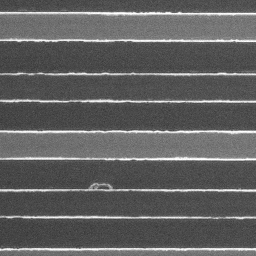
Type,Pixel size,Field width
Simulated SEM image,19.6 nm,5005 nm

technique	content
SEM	lines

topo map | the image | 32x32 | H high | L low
LLLLLLLLLLLLLLLLLLLLLLLLLLLLLLLL
LLLLLLLLLLLLLLLLLLLLLLLLLLLLLLLL
HHHHHHHHHHHHHHHHHHHHHHHHHHHHHHHH
HHHHHHHHHHHHHHHHHHHHHHHHHHHHHHHH
HHHHHHHHHHHHHHHHHHHHHHHHHHHHHHHH
LLLLLLLLLLLLLLLLLLLLLLLLLLLLLLLL
LLLLLLLLLLLLLLLLLLLLLLLLLLLLLLLL
LLLLLLLLLLLLLLLLLLLLLLLLLLLLLLLL
LLLLLLLLLLLLLLLLLLLLLLLLLLLLLLLL
HHHHHHHHHHHHHHHHHHHHHHHHHHHHHHHH
HHHHHHHHHHHHHHHHHHHHHHHHHHHHHHHH
HHHHHHHHHHHHHHHHHHHHHHHHHHHHHHHH
HHHHHHHHHHHHHHHHHHHHHHHHHHHHHHHH
LLLLLLLLLLLLLLLLLLLLLLLLLLLLLLLL
LLLLLLLLLLLLLLLLLLLLLLLLLLLLLLLL
LLLLLLLLLLLLLLLLLLLLLLLLLLLLLLLL
HLLLLLLLLLLLLLHHHLLLLLLLLLHLLLLL
HHHHHHHHHHHHHHHHHHHHHHHHHHHHHHHH
HHHHHHHHHHHHHHHHHHHHHHHHHHHHHHHH
HHHHHHHHHHHHHHHHHHHHHHHHHHHHHHHH
LLLLLLLLLLLLLLLLLLLLLLLLLLLLLLLL
LLLLLLLLLLLLLLLLLLLLLLLLLLLLLLLL
LLLLLLLLLLLLLLLLLLLLLLLLLLLLLLLL
LLLLLLLLLLLLLLLLLLLLLLLLLLLLLLLL
HHHHHHHHHHHHHHHHHHHHHHHHHHHHHHHH
HHHHHHHHHHHHHHHHHHHHHHHHHHHHHHHH
HHHHHHHHHHHHHHHHHHHHHHHHHHHHHHHH
LLLLLLLLLLLLLLLLLLLLLLLLLLLLLLLL
LLLLLLLLLLLLLLLLLLLLLLLLLLLLLLLL
LLLLLLLLLLLLLLLLLLLLLLLLLLLLLLLL
LLLLLLLLLLLLLLLLLLLLLLLLLLLLLLLL
HHHHHHHHHHHHHHHHHHHHHHHHHHHHHHHH